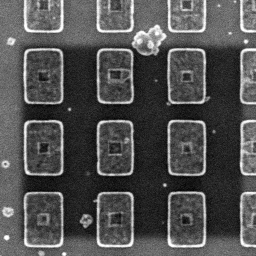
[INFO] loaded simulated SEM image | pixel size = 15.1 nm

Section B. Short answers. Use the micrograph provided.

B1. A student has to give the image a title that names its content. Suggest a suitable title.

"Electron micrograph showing wiring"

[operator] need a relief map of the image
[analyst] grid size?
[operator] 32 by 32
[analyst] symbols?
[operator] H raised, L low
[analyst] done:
LLLHHLHHLLLLHHLHLLLLLHHLHHLLLLHH
LLLHHHHHLLLLHHHHLLLLLHHHHLLLLLHH
LLLHHHHHLLLLHHHHLLLLLHHHHLLLLLHH
LLLHHHHHLLLLHHHHLLLLLHHHHLLLLLHH
LLLLLLLLLLLLLLLLLLLLLLLLLLLLLLLL
LLLLLLLLLLLLLLLLLLHLLLLLLLLLLLLL
LLLHHHHLLLLLLHHHLLLLLHHHHLLLLLHH
LLLHHHHHLLLLHHHHLLLLLHHHHLLLLLHH
LLLHHHHHLLLLHHHHLLLLLHHHHLLLLLHH
LLLHHLHHLLLLHHLHLLLLLHHLHLLLLLHH
LLLHHHHHLLLLHHHHLLLLLHHHHLLLLLHH
LLLHHHHHLLLLHHHHHLLLLHHHHLLLLLHH
LLLHHHHHLLLLLHHHLLLLLHHHHLLLLLHH
LLLLLLLLLLLLLLLLLLLLLLLLLLLLLLLL
LLLLLLLLLLLLLLLLLLLLLLLLLLLLLLLL
LLLHHHHLLLLLLHHHLLLLLHHHHLLLLLHH
LLLHHHHHLLLLHHHHLLLLLHHHHHLLLLHH
LLLHHHHHLLLLHHHHLLLLLHHHHHLLLLHH
LLLHHLHHLLLLHHLHHLLLLHHLHHLLLLHH
LLLHHHHHLLLLHHHHHLLLLHHHHLLLLLHH
LLLHHHHHLLLLHHHHHLLLLHHHHLLLLLHH
LLLHHHHLLLLLLHHHLLLLLHHHHLLLLLHH
LLLLLLLLLLLLLLLLLLLLLLLLLLLLLLLL
LLLLLLLLLLLLLLLLLLLLLLLLLLLLLLLL
LLLHHHHHLLLLLHHHLLLLLHHHHLLLLLHH
LLLHHHHHLLLLHHHHLLLLLHHHHLLLLLHH
LLLHHHHHLLLLHHHHLLLLLHHHHHLLLLHH
LLLHHLHHLLLLHHLHLLLLLHHLHHLLLLHH
LLLHHHHHLLLLHHHHLLLLLHHHHHLLLLHH
LLLHHHHHLLLLHHHHLLLLLHHHHLLLLLHH
LLLHHHHLLLLLLHHHLLLLLHHHHLLLLLHH
LLLLLLLLLLLLLLLLLLLLLLLLLLLLLLLL